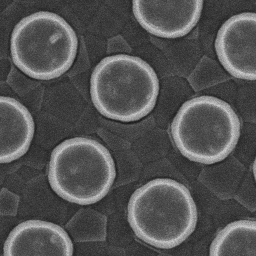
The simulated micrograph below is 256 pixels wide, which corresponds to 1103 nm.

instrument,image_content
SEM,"raised bodies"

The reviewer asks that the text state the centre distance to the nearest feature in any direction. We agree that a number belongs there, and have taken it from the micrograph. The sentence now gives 0.393 microns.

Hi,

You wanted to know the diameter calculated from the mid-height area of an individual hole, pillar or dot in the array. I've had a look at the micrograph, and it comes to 61.9 px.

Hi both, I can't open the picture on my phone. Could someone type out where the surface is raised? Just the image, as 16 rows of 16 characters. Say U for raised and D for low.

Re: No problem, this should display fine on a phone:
DDDDDDDDUUUUDDDD
DUUUDDDDDUUUDDUU
DUUUUDDDDDDDDDUU
DUUUUDDDDDDDDDUU
DDUUDDUUUDDDDDDU
DDDDDDUUUUDDDDDD
UDDDDDUUUDDDUUDD
UUDDDDDDDDDUUUUD
UUDDDDDDDDDUUUUD
UDDDUUDDDDDDUUDD
DDDUUUUDDDDDDDDD
DDDUUUUDDUUDDDDD
DDDDDUDDUUUUDDDD
DDDDDDDDUUUUDDDD
DUUUDDDDDUUUDDUU
UUUUDDDDDDDDDUUU